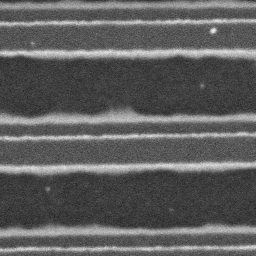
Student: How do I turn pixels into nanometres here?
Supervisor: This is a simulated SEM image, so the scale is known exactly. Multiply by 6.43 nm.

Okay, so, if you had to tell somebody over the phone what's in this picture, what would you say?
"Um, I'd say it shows lines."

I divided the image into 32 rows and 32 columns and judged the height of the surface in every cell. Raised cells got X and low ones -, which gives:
--------------------------------
XXXXXXXXXXXXXXXXXXXXXXXXXXXXXXXX
XXXXXXXXXXXXXXXXXXXXXXXXXXXXXXXX
XXXXXXXXXXXXXXXXXXXXXXXXXXXXXXXX
XXXXXXXXXXXXXXXXXXXXXXXXXXXXXXXX
XXXXXXXXXXXXXXXXXXXXXXXXXXXXXXXX
XXXXXXXXXXXXXXXXXXXXXX-XXX--X-XX
--------------------------------
--------------------------------
--------------------------------
--------------------------------
--------------------------------
--------------------------------
--------------------------------
--------------------------------
XXXXXXXXXXXXXXXXXXXXXXXXXXXXXXXX
XXXXXXXXXXXXXXXXXXXXXXXXXXXXXXXX
XXXXXXXXXXXXXXXXXXXXXXXXXXXXXXXX
XXXXXXXXXXXXXXXXXXXXXXXXXXXXXXXX
XXXXXXXXXXXXXXXXXXXXXXXXXXXXXXXX
XXXXXXXXXXXXXXXXXXXXXXXXXXXXXXXX
--------------------------------
--------------------------------
--------------------------------
--------------------------------
--------------------------------
--------------------------------
--------------------------------
--------------------------------
XXXXXXXXXXXXXXXXXXXXXXXXXXXXXXXX
XXXXXXXXXXXXXXXXXXXXXXXXXXXXXXXX
XXXXXXXXXXXXXXXXXXXXXXXXXXXXXXXX